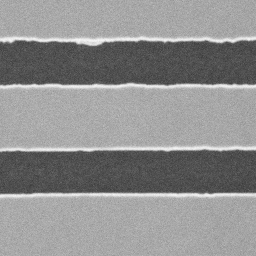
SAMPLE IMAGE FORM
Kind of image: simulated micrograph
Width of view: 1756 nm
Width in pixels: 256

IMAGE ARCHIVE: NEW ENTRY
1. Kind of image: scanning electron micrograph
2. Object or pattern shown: lines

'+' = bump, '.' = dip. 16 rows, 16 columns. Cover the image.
++++++++++++++++
++++++++++++++++
+.+++++++++++++.
................
................
++++++++++++++++
++++++++++++++++
++++++++++++++++
++++++++++++++++
................
................
................
++++++++++++++++
++++++++++++++++
++++++++++++++++
++++++++++++++++